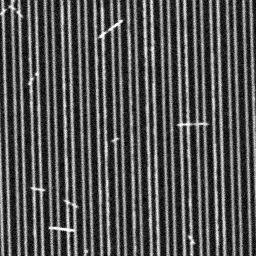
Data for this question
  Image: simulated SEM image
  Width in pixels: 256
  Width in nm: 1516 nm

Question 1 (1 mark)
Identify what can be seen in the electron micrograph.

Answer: parallel lines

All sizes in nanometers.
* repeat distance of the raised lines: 49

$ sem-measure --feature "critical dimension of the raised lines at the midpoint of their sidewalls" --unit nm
11.8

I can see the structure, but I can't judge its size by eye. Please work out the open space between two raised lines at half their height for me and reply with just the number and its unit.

33.3 nm